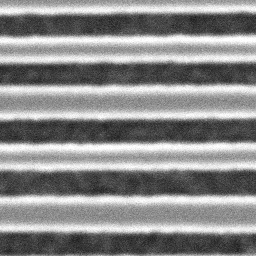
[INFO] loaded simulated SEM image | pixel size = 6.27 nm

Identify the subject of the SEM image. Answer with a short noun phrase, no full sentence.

lines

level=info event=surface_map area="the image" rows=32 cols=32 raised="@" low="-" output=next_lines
@@@@@@@@@@@@@@@@@@@@@@@@@@@@@@@@
@@@@@@@@@@@@@@--@---------------
--------------------------------
--------------------------------
--------------------------------
@@@@@@@@@@@@@@@@@@@@@@@@@@@@@@@@
@@@@@@@@@@@@@@@@@@@@@@@@@@@@@@@@
@@@@@@@@@@@@@@@@@@@@@@@@@@@@@@@@
--------------------------------
--------------------------------
--------------------------------
@@@@@@@@@@@@@@@@@@@@@@@@@@@@@@@@
@@@@@@@@@@@@@@@@@@@@@@@@@@@@@@@@
@@@@@@@@@@@@@@@@@@@@@@@@@@@@@@@@
@@@@@@@@@@@@@@@@@@@@@@@@@@@@@@@@
--------------------------------
--------------------------------
--------------------------------
@@@@@@@@@@@@@@@@@@@@@@@@@@@@@@@@
@@@@@@@@@@@@@@@@@@@@@@@@@@@@@@@@
@@@@@@@@@@@@@@@@@@@@@@@@@@@@@@@@
--------------------------------
--------------------------------
--------------------------------
--------------------------------
@@@@@@@@@@@@@@@@@@@@@@@@@@@@@@@@
@@@@@@@@@@@@@@@@@@@@@@@@@@@@@@@@
@@@@@@@@@@@@@@@@@@@@@@@@@@@@@@@@
@@@@@@@@@@@@@@@@@@@@@@@@@@@@@@@@
--------------------------------
--------------------------------
--------------------------------